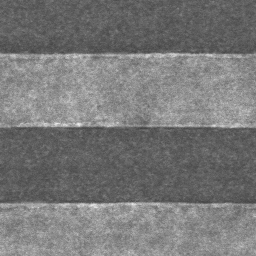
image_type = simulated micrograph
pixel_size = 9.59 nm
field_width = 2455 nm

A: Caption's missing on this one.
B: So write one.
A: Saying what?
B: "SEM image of one or a few lines or trenches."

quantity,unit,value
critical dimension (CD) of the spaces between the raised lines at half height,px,78.2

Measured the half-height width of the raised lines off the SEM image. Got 683 nm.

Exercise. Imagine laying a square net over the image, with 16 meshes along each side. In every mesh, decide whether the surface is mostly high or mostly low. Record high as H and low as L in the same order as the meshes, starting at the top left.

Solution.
LLLLLLLLLLLLLLLL
LLLLLLLLLLLLLLLL
LLLLLLLLLLLLLLLL
HLLLHHHLHHHHHHHH
HHHHHHHHHHHHHHHH
HHHHHHHHHHHHHHHH
HHHHHHHHHHHHHHHH
HHHHHHHHHHHHHHHH
LLLLLLLLLLLLLLLL
LLLLLLLLLLLLLLLL
LLLLLLLLLLLLLLLL
LLLLLLLLLLLLLLLL
LLLLLLLLLLLLLLLL
HHHHHHHHHHHHHHHH
HHHHHHHHHHHHHHHH
HHHHHHHHHHHHHHHH